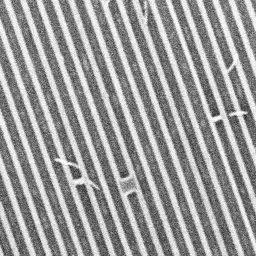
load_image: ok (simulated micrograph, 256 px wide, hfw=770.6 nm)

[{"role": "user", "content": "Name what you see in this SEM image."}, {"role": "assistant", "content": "parallel lines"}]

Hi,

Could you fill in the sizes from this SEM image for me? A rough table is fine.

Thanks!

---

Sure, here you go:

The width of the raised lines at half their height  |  14.9 nanometers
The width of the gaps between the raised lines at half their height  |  29.8 nm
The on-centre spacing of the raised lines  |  45.5 nm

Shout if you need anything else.